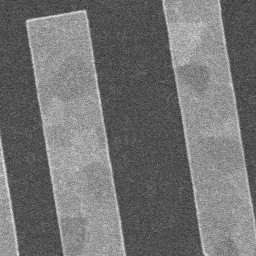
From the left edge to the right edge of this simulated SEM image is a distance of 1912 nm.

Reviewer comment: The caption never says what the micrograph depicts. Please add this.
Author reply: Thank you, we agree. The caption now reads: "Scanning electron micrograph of one or a few lines or trenches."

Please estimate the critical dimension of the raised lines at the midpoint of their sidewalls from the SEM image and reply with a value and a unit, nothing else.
444 nm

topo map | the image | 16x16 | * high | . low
..........****..
..****....****..
..****.....***..
..****.....***..
..****.....***..
..****.....****.
..****.....****.
...***.....****.
...****.....***.
...****.....***.
...****.....***.
...****.....****
*..****.....****
*...***.....****
*...****....****
*...****.....***